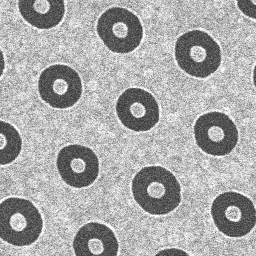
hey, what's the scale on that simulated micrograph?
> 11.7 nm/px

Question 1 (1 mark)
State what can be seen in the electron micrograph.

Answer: ring-shaped grooves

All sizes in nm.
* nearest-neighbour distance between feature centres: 949